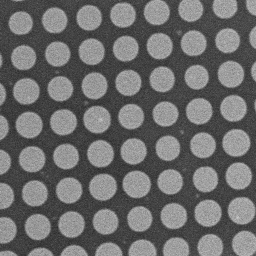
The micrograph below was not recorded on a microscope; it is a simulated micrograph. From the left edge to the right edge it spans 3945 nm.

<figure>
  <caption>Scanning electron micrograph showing an array of small figures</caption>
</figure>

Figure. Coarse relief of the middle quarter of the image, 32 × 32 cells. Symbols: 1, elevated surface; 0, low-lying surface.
00000000000000000000000000000000
00000000000000000000000111100001
00000011100000111100001111100011
00000111110001111110001111110011
11000111111001111110001111110001
11000111111001111110001111100001
11000111111000111110000111000000
11000111110000011100000000000000
10000001100000000000000000000000
00000000000000000000000000000000
00000000000000011100000111110001
00000011111000111110001111110001
11000111111000111111001111110001
11100111111000111111001111110001
11100111111000111111000111110000
11100111111000011110000000000000
11000011110000000000000000000000
10000000000000000000000000000000
00000000000000000000000011110000
00000000110000011110000111111000
11000001111100011111000111111000
11100011111100111111000111111000
11100011111100111111000111111000
11110011111100011111000011110000
11100001111100001110000000000000
11100000110000000000000000000000
00000000000000000000000000000000
00000000000000001111000011111000
00000001111100011111100011111000
11110001111110011111100111111000
11110011111110011111110011111000
11110001111110011111100011111000